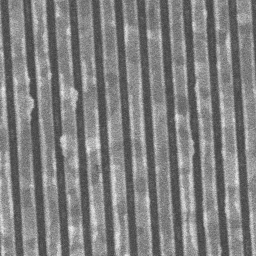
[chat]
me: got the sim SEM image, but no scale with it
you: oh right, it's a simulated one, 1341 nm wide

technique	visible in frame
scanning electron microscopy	parallel lines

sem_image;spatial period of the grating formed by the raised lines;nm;119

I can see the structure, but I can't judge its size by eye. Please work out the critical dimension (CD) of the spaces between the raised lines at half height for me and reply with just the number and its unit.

48.4 nm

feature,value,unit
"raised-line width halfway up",71.3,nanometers